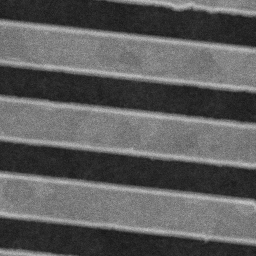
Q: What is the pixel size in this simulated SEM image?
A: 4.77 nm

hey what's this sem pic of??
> one or a few lines or trenches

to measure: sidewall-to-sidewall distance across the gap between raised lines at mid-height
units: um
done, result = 0.176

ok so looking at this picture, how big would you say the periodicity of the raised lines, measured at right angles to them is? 360 nm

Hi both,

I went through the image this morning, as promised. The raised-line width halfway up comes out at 185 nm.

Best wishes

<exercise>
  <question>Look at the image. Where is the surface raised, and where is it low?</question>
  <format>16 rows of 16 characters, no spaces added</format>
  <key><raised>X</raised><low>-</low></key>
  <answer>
-------------XXX
X---------------
XXXXXXXXXX------
XXXXXXXXXXXXXXXX
------XXXXXXXXXX
---------------X
XXX-------------
XXXXXXXXXXXX----
XXXXXXXXXXXXXXXX
--------XXXXXXXX
----------------
XXXXX-----------
XXXXXXXXXXXXXX--
-XXXXXXXXXXXXXXX
----------XXXXXX
----------------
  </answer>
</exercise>